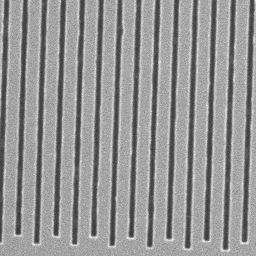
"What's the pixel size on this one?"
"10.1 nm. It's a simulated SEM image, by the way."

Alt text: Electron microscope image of parallel lines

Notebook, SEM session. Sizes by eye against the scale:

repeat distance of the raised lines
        190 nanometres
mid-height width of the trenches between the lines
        51.5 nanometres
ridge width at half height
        137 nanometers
